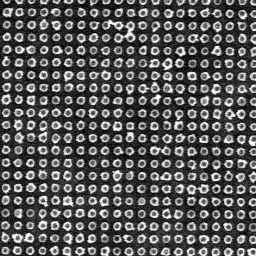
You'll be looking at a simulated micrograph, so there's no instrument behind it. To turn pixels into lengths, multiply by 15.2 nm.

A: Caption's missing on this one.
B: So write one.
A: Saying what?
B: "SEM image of a regular array of raised bodies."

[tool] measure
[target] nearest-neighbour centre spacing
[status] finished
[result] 182 nm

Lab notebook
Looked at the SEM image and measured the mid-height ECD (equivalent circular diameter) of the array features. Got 122 nm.